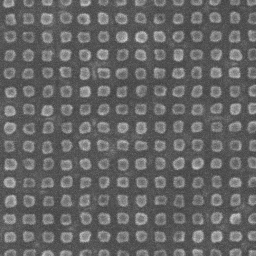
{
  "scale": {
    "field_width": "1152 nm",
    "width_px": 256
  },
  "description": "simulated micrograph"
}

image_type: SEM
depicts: a regular array of raised bodies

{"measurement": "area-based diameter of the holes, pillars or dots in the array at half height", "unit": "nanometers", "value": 50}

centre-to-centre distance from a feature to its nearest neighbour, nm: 79.9